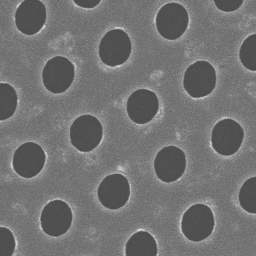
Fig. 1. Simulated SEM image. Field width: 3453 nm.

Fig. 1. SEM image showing a regular array of holes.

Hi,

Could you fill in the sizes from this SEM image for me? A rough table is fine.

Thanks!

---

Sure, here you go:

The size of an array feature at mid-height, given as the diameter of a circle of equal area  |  468 nm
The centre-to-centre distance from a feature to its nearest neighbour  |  849 nm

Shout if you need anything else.